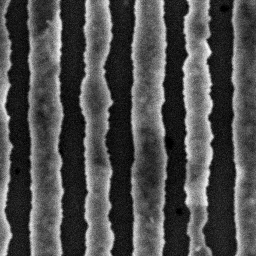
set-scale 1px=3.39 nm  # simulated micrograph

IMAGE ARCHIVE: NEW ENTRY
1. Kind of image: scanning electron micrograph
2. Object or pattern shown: lines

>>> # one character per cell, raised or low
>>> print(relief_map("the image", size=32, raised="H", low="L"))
HLLHHHHLLLLHHHLLLHHHLLLLHHLLLHHH
HLLHHHHLLLLHHHLLLHHHLLLLHHLLLHLH
HLLHHHHHLLLHHHLLLHHHLLLHHHLLLHHH
HLLLHHHHLLLHHHLLLHHHHLLHHHLLLHHH
HLLLHHHHLLLHHHLLLHHHHLLHHHLLLHHH
HLLLHHHHLLLHHHLLLHHHHLLHHHLLLHHH
HLLLHHHHLLLHHHLLLHHHHLLHHHLLLHHH
HLLLHHHLLLLHHLLLLHHHHLLHHHLLLHHH
HLLLHHHHLLLHHLLLLHHHHLLHHHLLLHHH
HLLLHHHLLLLHHLLLLHHHHLLHHHLLLHHH
HLLLHHHLLLHHHLLLLHHHLLLHHHLLLHHH
HLLLHHHLLLHHHHLLLHHHLLLHHHLLLHHH
HLLLHHHHLLHHHHLLLHHHLLLHHHLLLHHH
HLLLHHHHLLHHHHLLLHHHLLLHHHLLLHHH
HLLHHHHHLLLHHHLLLHHHLLLHHHLLLHHH
HLLLHHHHLLLHHLLLLHHHLLLHHHLLLHHH
HLLLHHHHLLLHHLLLLHHHHLLHHHLLLHHH
HLLLHHHLLLLHHLLLLHHHHLLHHHLLLHHH
HLLLHHHLLLLHHLLLLHHHHLLHHHLLLHHH
HLLLHHHHLLLHHHLLLHHHHLLHHHLLLHHH
HLLLHHHHLLLHHHLLLHHHHLLHHHLLLHHH
HLLLHHHHLLLHHHLLLHHHHLLHHHLLLLHH
HLLLHHHHLLLHHHLLLHHHHLLHHHLLLLHH
HLLLHHHHLLLHHHLLLHHHHLLHHHLLLHHH
HLLLHHHHLLLHHHLLLHHHHLLHHHLLLHHH
HLLLHHHHLLLHHHLLLHHHHLLHHHLLLHHH
HLLLHHHHLLLHHHLLLHHHLLLLHHLLLHHH
HLLLHHHHLLLHHHLLLHHHLLLLHHLLLHHH
HLLLHHHHLLLHHHLLLHHHLLLHHLLLLLHH
HLLLHHHHLLLHHHLLLHHHLLLLHHLLLLHH
HLLLHHHHLLLHHHLLLHHHHLLLHHLLLLHH
HLLLHHHHLLLHHHLLLHHHLLLLHHLLLLHH